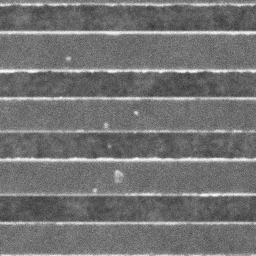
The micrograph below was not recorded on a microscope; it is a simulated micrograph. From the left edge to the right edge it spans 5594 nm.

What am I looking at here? lines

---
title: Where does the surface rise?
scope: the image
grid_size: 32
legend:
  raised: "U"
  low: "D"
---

UUUUUUUUUUDDDUUUUUUUUUDDUUUUDUUU
DDDDDDDDDDDDDDDDDDDDDDDDDDDDDDDD
DDDDDDDDDDDDDDDDDDDDDDDDDDDDDDDD
DDDDDDDDDDDDDDDDDDDDDDDDDDDDDDDD
UUUUUUUUUUUUUUUUUUUUUUUUUUUUUUUU
UUUUUUUUUUUUUUUUUUUUUUUUUUUUUUUU
UUUUUUUUUUUUUUUUUUUUUUUUUUUUUUUU
UUUUUUUUUUUUUUUUUUUUUUUUUUUUUUUU
UUUUUUUUUUUUUUUUUUUUUUUUUUUUUUUU
DDDDDDDDDDDDDDDDDDDDDDDDDDDDDDDD
DDDDDDDDDDDDDDDDDDDDDDDDDDDDDDDD
DDDDDDDDDDDDDDDDDDDDDDDDDDDDDDDD
UUUUUUUUUUUUUUUUUUUUUUUUUUUUUUUU
UUUUUUUUUUUUUUUUUUUUUUUUUUUUUUUU
UUUUUUUUUUUUUUUUUUUUUUUUUUUUUUUU
UUUUUUUUUUUUUUUUUUUUUUUUUUUUUUUU
DDDDDDDDDDDDDDDDDDDDDDDDDDDDDDDD
DDDDDDDDDDDDDDDDDDDDDDDDDDDDDDDD
DDDDDDDDDDDDDDDDDDDDDDDDDDDDDDDD
DDDDDDDDDDDDDDDDDDDDDDDDDDDDDDDD
UUUUUUUUUUUUUUUUUUUUUUUUUUUUUUUU
UUUUUUUUUUUUUUUUUUUUUUUUUUUUUUUU
UUUUUUUUUUUUUUUUUUUUUUUUUUUUUUUU
UUUUUUUUUUUUUUUUUUUUUUUUUUUUUUUU
DDDDDDDDDDDDDDDDDDDDDDDDDDDDDDDD
DDDDDDDDDDDDDDDDDDDDDDDDDDDDDDDD
DDDDDDDDDDDDDDDDDDDDDDDDDDDDDDDD
DDDDDDDDDDDDDDDDDDDDDDDDDDDDDDDD
UUUUUUUUUUUUUUUUUUUUUUUUUUUUUUUU
UUUUUUUUUUUUUUUUUUUUUUUUUUUUUUUU
UUUUUUUUUUUUUUUUUUUUUUUUUUUUUUUU
UUUUUUUUUUUUUUUUUUUUUUUUUUUUUUUU